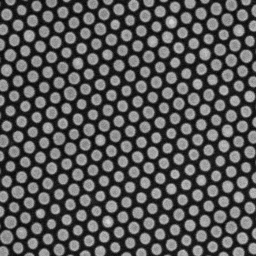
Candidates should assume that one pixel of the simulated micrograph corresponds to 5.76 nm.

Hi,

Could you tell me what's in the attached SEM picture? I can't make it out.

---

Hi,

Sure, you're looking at a regular array of raised bodies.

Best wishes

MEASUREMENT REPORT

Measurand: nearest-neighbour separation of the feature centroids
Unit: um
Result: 0.0879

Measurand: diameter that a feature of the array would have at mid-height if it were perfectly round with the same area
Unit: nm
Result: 59.2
